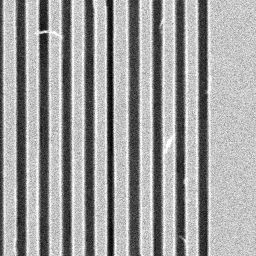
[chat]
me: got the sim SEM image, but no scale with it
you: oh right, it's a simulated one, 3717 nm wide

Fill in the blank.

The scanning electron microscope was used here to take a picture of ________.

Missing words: parallel lines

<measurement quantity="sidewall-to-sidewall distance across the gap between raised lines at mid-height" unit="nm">138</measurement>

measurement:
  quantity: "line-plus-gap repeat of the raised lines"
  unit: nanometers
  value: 330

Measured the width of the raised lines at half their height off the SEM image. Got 194 nm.